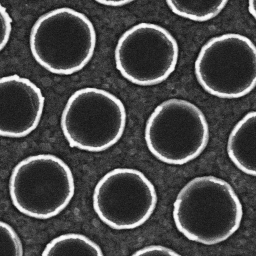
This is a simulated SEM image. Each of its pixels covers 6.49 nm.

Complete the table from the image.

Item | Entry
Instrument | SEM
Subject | raised bodies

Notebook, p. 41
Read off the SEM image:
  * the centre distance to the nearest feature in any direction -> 83.7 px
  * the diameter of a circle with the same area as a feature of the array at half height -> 404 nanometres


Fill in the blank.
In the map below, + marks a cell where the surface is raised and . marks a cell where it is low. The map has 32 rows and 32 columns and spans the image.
..............+......+++++++...+
+......++.............+++++....+
+....++++++..............+......
+...++++++++.....+++............
+...++++++++...++++++.......++..
+...++++++++...+++++++....+++++.
....++++++++...+++++++...+++++++
.....++++++....+++++++...+++++++
......++++.....+++++++..++++++++
................+++++....+++++++
++++.....................+++++++
+++++.....+++.............+++++.
+++++....++++++.................
+++++...+++++++.....++++........
+++++...++++++++...++++++......+
+++++...+++++++....+++++++....++
+++.....+++++++...++++++++...+++
.........++++++...++++++++...+++
..........+++......++++++....+++
.....+..............++++.....+++
...+++++..............+.......++
..+++++++.....+++..............+
.++++++++....+++++.......++.....
.++++++++...+++++++....++++++...
.++++++++...+++++++....++++++...
..++++++....+++++++...++++++++..
...++++.....+++++++...++++++++..
.............+++++....++++++++..
+.....................++++++++..
++......++.............+++++....
++....++++++....................
+++...++++++.....++++...........